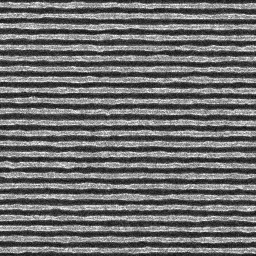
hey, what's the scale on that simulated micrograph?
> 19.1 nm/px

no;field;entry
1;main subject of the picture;parallel lines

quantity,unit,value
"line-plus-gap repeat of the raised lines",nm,203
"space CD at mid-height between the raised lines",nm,112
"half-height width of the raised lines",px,4.87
